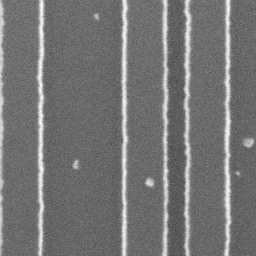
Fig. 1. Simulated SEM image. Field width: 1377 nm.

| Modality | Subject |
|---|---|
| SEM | lines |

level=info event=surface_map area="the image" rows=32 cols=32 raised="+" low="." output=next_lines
+++++...........+++++..+++++....
+++++...........+++++..+++++....
+++++...........+++++..+++++....
+++++...........+++++..+++++....
+++++...........+++++..+++++....
+++++...........+++++..+++++....
+++++...........+++++..+++++....
+++++...........+++++..+++++....
+++++..........++++++..+++++....
+++++...........+++++..+++++....
+++++..........++++++..+++++....
+++++...........+++++..+++++....
+++++...........+++++..+++++....
+++++...........+++++..+++++....
+++++...........+++++..++++++...
+++++..........++++++..++++++...
+++++..........++++++..+++++....
+++++...........+++++..+++++....
+++++...........+++++..+++++....
+++++...........+++++..+++++....
+++++..........++++++..+++++....
+++++...........+++++..+++++....
+++++..........++++++..+++++....
+++++...........+++++..++++++...
+++++..........++++++..+++++....
+++++...........+++++..+++++....
+++++..........++++++..++++++...
+++++...........+++++..++++++...
+++++...........+++++..+++++....
+++++..........++++++..++++++...
+++++..........++++++..+++++....
+++++..........++++++..+++++....